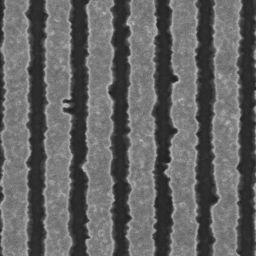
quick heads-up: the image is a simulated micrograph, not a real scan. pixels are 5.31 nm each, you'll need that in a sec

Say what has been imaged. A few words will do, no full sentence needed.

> parallel lines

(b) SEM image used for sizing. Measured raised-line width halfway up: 142 nm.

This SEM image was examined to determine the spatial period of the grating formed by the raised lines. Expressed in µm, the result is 0.224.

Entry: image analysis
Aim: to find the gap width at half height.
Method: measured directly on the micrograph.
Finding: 82.3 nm